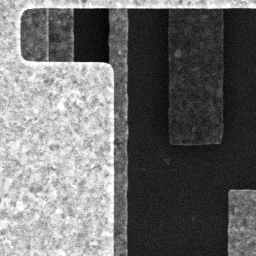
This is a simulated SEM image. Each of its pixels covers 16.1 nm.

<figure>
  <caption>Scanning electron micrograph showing wiring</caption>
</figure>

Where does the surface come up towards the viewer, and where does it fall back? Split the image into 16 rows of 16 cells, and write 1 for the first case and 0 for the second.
1110000000000000
1110000000000000
1110000000000000
1110000000000000
1111111000000000
1111111000000000
1111111000000000
1111111000000000
1111111000000000
1111111000000000
1111111000000000
1111111000000000
1111111000000000
1111111000000000
1111111000000000
1111111000000000